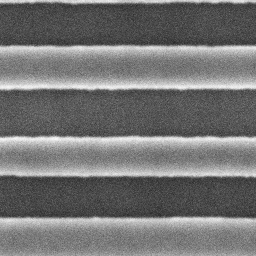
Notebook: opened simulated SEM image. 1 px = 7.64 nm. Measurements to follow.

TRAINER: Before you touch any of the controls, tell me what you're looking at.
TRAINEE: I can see lines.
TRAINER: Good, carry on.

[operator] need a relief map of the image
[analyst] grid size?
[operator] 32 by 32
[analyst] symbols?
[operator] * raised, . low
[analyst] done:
................................
................................
................................
................................
................................
................................
********************************
********************************
********************************
********************************
********************************
................................
................................
................................
................................
................................
................................
********************************
********************************
********************************
********************************
********************************
................................
................................
................................
................................
................................
********************************
********************************
********************************
********************************
********************************